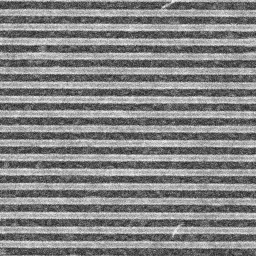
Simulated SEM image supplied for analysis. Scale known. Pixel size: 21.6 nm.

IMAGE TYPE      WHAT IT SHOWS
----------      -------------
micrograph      parallel lines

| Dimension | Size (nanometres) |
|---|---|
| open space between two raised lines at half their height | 192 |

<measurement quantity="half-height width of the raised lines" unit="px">5.5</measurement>